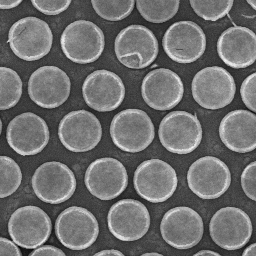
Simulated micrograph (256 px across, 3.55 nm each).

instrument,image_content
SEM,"a regular array of raised bodies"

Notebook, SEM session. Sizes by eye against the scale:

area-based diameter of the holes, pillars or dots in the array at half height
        144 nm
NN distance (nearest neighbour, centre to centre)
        170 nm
